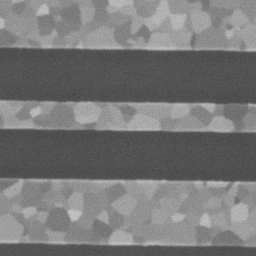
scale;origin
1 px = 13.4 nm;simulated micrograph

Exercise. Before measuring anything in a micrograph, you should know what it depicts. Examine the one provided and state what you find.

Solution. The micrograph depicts lines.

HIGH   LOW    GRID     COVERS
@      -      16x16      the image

@@@@@@@@@@@@@@@@
@@@@@@@@@@@@@@@@
@@@@@@@@@@@@@@@@
----------------
----------------
----------------
@@@@@@@@@@@@@@@@
@@@@@@@@@@@@@@@@
----------------
----------------
----------------
@@@@@@@@@@@@@@@@
@@@@@@@@@@@@@@@@
@@@@@@@@@@@@@@@@
@@@@@@@@@@@@@@@@
----------------